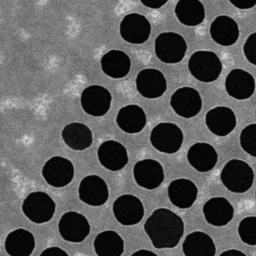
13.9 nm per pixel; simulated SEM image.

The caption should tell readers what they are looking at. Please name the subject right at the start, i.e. a regular array of holes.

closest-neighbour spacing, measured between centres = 554 nm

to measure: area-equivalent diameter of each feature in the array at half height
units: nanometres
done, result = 431